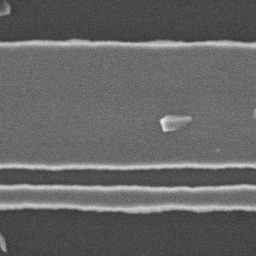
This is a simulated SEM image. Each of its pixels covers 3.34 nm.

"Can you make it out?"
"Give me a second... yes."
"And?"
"lines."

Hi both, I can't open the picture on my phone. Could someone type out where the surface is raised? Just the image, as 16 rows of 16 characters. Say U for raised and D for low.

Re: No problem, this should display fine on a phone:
DDDDDDDDDDDDDDDD
DDDDDDDDDDDDDDDD
DDDDDDDDDDDDDDDD
UUUUUUUUUUUUUUUU
UUUUUUUUUUUUUUUU
UUUUUUUUUUUUUUUU
UUUUUUUUUUUUUUUU
UUUUUUUUUUUUUUUU
UUUUUUUUUUUUUUUU
UUUUUUUUUUUUUUUU
UUUUUUUUUUUUUUUU
UUUUUUUUUUUUUUUU
UUUUUUUUUUUUUUUU
DDDDDDDDDDDDDDDD
DDDDDDDDDDDDDDDD
DDDDDDDDDDDDDDDD